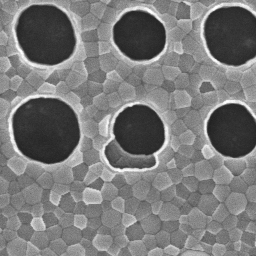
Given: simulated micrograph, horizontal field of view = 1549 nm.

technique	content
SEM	holes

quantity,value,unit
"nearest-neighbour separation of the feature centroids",566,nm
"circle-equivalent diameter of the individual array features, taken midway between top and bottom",341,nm